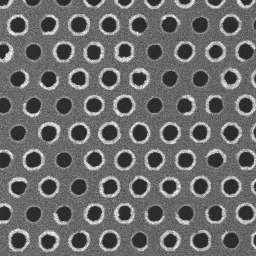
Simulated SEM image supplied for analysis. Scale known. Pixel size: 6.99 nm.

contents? a regular array of holes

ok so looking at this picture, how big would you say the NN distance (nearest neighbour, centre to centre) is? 0.211 µm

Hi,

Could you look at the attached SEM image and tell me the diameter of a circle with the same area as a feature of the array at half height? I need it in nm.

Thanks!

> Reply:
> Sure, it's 104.